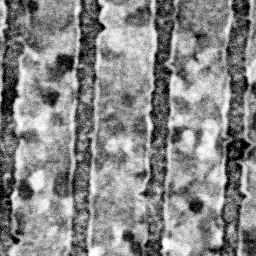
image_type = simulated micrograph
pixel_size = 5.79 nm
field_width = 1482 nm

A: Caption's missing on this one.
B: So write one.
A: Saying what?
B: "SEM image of one or a few lines or trenches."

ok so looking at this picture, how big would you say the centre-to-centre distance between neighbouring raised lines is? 438 nm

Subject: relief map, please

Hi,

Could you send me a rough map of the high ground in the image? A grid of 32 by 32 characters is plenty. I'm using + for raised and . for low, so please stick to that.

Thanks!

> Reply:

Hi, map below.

+..+++++++...++++++...+++++++..+
+..+++++++...++++++...+++++++..+
+..+++++++...++++++...+++++++..+
+..+++++++...++++++...+++++++..+
...+++++++..+++++++...++++++...+
...+++++++..++++++++..++++++...+
...+++++++..+++++++...++++++...+
...++++++...+++++++..+++++++...+
...++++++...+++++++..+++++++...+
...++++++...+++++++...+++++++..+
..++++++++..+++++++..++++++++..+
..++++++++..+++++++..+++++++...+
..+++++++...+++++++..++++++++..+
..+++++++...+++++++..+++++++...+
..+++++++...+++++++..+++++++...+
..+++++++...+++++++..+++++++...+
..+++++++...+++++++..+++++++...+
..+++++++...+++++++..++++++++..+
..+++++++...+++++++..+++++++...+
..+++++++...++++++...+++++++..++
..+++++++...++++++...+++++++..++
..+++++++...+++++++..+++++++...+
..+++++++..+++++++...+++++++..++
..+++++++..+++++++...+++++++..++
.++++++++..++++++....+++++++...+
..+++++++..+++++++...+++++++..++
..+++++++..+++++++...++++++...++
..+++++++..+++++++...+++++++..++
..+++++++..+++++++...+++++++..++
..+++++++..+++++++...+++++++..++
..+++++++..+++++++..++++++++..++
..+++++++..+++++++..+++++++...++